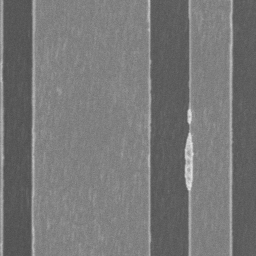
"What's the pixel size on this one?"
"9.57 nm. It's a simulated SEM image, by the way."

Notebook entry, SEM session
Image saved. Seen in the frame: lines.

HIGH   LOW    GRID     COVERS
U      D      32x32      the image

DDDDUUUUUUUUUUUUUUUDDDDDUUUUUDDD
DDDDUUUUUUUUUUUUUUUDDDDDUUUUUDDD
DDDDUUUUUUUUUUUUUUUDDDDDUUUUUDDD
DDDDUUUUUUUUUUUUUUUDDDDDUUUUUDDD
DDDDUUUUUUUUUUUUUUUDDDDDUUUUUDDD
DDDDUUUUUUUUUUUUUUUDDDDDUUUUUDDD
DDDDUUUUUUUUUUUUUUUDDDDDUUUUUDDD
DDDDUUUUUUUUUUUUUUUDDDDDUUUUUDDD
DDDDUUUUUUUUUUUUUUUDDDDDUUUUUDDD
DDDDUUUUUUUUUUUUUUUDDDDDUUUUUDDD
DDDDUUUUUUUUUUUUUUUDDDDDUUUUUDDD
DDDDUUUUUUUUUUUUUUUDDDDDUUUUUDDD
DDDDUUUUUUUUUUUUUUUDDDDDUUUUUDDD
DDDDUUUUUUUUUUUUUUUDDDDDUUUUUDDD
DDDDUUUUUUUUUUUUUUUDDDDDUUUUUDDD
DDDDUUUUUUUUUUUUUUUDDDDDUUUUUDDD
DDDDUUUUUUUUUUUUUUUDDDDDUUUUUDDD
DDDDUUUUUUUUUUUUUUUDDDDUUUUUUDDD
DDDDUUUUUUUUUUUUUUUDDDDUUUUUUDDD
DDDDUUUUUUUUUUUUUUUDDDDUUUUUUDDD
DDDDUUUUUUUUUUUUUUUDDDDUUUUUUDDD
DDDDUUUUUUUUUUUUUUUDDDDUUUUUUDDD
DDDDUUUUUUUUUUUUUUUDDDDUUUUUUDDD
DDDDUUUUUUUUUUUUUUUDDDDDUUUUUDDD
DDDDUUUUUUUUUUUUUUUDDDDDUUUUUDDD
DDDDUUUUUUUUUUUUUUUDDDDDUUUUUDDD
DDDDUUUUUUUUUUUUUUUDDDDDUUUUUDDD
DDDDUUUUUUUUUUUUUUUDDDDDUUUUUDDD
DDDDUUUUUUUUUUUUUUUDDDDDUUUUUDDD
DDDDUUUUUUUUUUUUUUUDDDDDUUUUUDDD
DDDDUUUUUUUUUUUUUUUDDDDDUUUUUDDD
DDDDUUUUUUUUUUUUUUUDDDDDUUUUUDDD